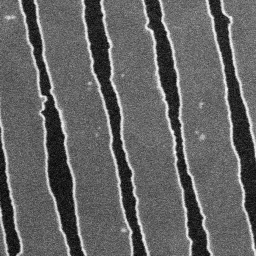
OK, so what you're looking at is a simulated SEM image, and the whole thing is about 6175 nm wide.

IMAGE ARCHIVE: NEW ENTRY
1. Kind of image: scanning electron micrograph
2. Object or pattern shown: one or a few lines or trenches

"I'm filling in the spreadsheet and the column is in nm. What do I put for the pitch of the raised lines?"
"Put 1490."